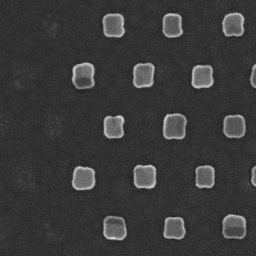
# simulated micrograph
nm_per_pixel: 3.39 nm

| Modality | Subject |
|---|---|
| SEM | a regular array of raised bodies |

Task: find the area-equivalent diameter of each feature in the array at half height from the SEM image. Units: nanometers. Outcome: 78.1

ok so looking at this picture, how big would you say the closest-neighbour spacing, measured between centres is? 0.198 um